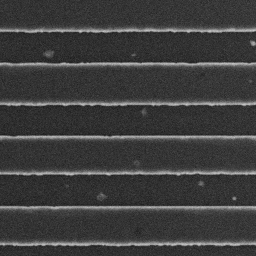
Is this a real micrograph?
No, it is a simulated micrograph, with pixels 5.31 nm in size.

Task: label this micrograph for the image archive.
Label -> lines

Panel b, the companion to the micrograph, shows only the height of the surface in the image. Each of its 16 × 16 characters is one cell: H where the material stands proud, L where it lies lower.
HHHHHHHHHHHHHHHH
HHHHHHHHHHHHHHHH
LLLLLLLLLLLLLLLL
LLLLLLLLLLLLLLLL
HHHHHHHHHHHHHHHH
HHHHHHHHHHHHHHHH
HHHHHHHHHHHHHHHH
LLLLLLLLLLLLLLLL
LLLLLLLLLLLLLLLL
HHHHHHHHHHHHHHHH
HHHHHHHHHHHHHHHH
LLLLLLLLLLLLLLLL
LLLLLLLLLLLLLLLL
HHHHHHHHHHHHHHHH
HHHHHHHHHHHHHHHH
LLLLLLLLLLLLLLLL